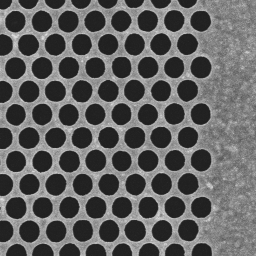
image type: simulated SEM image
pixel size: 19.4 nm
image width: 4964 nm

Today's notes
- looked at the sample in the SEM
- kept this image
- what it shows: a regular array of holes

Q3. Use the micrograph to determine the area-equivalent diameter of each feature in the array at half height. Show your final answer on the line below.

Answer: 414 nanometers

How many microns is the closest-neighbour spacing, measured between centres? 0.508